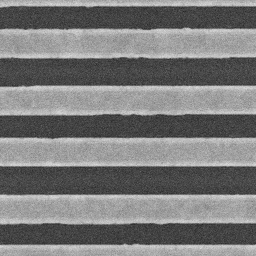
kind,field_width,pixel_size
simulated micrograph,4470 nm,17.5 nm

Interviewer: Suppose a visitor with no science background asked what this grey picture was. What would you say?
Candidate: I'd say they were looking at lines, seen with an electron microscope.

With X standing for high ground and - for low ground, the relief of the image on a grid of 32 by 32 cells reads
XXXXXXXXXXXXXXXXXXXXXXXXXXXXXXXX
--------------------------------
--------------------------------
--------------------------------
XXXXXXXXXXXXXXXXXXXXXXXXXXXXXXXX
XXXXXXXXXXXXXXXXXXXXXXXXXXXXXXXX
XXXXXXXXXXXXXXXXXXXXXXXXXXXXXXXX
--------------------------------
--------------------------------
--------------------------------
--------------------------------
XXXXXXXXXXXXXXXXXXXXXXXXXXXXXXXX
XXXXXXXXXXXXXXXXXXXXXXXXXXXXXXXX
XXXXXXXXXXXXXXXXXXXXXXXXXXXXXXXX
--------------------------------
--------------------------------
--------------------------------
XXXXXXXXXXXXXXXXXXXXXXXXXXXXXXXX
XXXXXXXXXXXXXXXXXXXXXXXXXXXXXXXX
XXXXXXXXXXXXXXXXXXXXXXXXXXXXXXXX
XXXXXXXXXXXXXXXXXXXXXXXXXXXXXXXX
--------------------------------
--------------------------------
--------------------------------
------------------X----------X--
XXXXXXXXXXXXXXXXXXXXXXXXXXXXXXXX
XXXXXXXXXXXXXXXXXXXXXXXXXXXXXXXX
XXXXXXXXXXXXXXXXXXXXXXXXXXXXXXXX
--------------------------------
--------------------------------
--------------------------------
XXXXXXXXXXXXXXXXXXXXXXXXXXXXXXXX